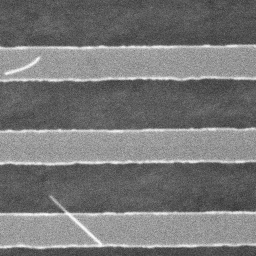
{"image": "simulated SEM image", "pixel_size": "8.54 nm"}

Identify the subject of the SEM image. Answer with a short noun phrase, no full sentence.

lines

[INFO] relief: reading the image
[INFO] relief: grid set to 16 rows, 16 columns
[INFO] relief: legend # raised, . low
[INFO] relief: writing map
................
................
................
################
################
................
................
................
################
################
................
................
................
################
################
..#.............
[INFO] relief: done